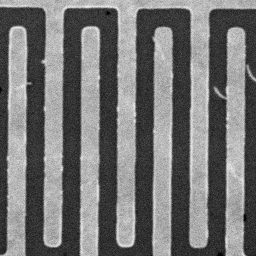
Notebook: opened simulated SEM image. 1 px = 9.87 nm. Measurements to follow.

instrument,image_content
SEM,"groups of lines, slits or small figures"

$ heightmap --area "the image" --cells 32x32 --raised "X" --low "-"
XXXXXXXXXXXXXXXXXXXXXXXXXXXXXXXX
------XX-------XX-------XX------
------XX-------XX-------XX------
--X---XX---X---XX---X---XX------
-XX---XX--XX---XX--XX---XX---XX-
-XX---XX--XX---XX--XX---XX---XX-
-XX---XX--XX---XX--XX---XX---XX-
-XX---XX--XX---XX--XX---XX---XX-
-XX---XX--XX---XX--XX---XX--XXX-
-XX---XX--XX---XX--XX---XX--XXX-
-XX---XX--XX---XX--XX---XX--XXX-
-XX---XX--XX---XX--XX---XX--XX--
-XX---XX--XX---XX--XX---XX--XXX-
-XX---XX--XX---XX--XX---XX--XXX-
-XX---XX--XX---XX--XX---XX--XX--
-XX---XX--XX---XX--XX---XX--XX--
-XX---XX--XX---XX--XX---XX--XXX-
-XX---XX--XX---XX--XX---XX--XX--
-XX---XX--XX---XX--XX---XX--XX--
-XX---XX--XX---XX--XX---XX--XX--
-XX---XX--XX---XX--XX---XX--XX--
-XX---XX--XX---XX--XX---XX--XX--
-XX---XX--XX---XX--XX---XX--XX--
-XX---XX--XX---XX--XX---XX--XX--
-XX---XX--XX---XX--XX---XX--XX--
-XX---XX--XX---XX--XX---XX--XX--
-XX---XX--XX---XX--XX---XX--XX--
-XX---XX--XX---XX--XX---XX--XX--
-XX---XX--XX---XX--XX---XX--XX--
-XX---XX--XX---XX--XX---XX--XX--
-XX---X---XX---X---XX---XX--XX--
-XX-------XX-------XX-------XX--